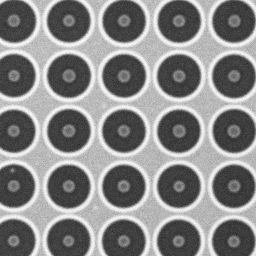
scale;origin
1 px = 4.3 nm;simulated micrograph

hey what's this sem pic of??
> an array of small figures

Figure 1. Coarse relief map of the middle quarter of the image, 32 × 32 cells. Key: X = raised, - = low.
-------XXX----------XXX---------
-------XX------------XX---------
XX-----XX-----XX-----XX-----XX--
XX-----XX-----XX-----XX-----XX--
-------XX------------XX---------
-------XXX----------XXX---------
------XXXX----------XXXX--------
-----XXXXXX--------XXXXXX-------
---XXXXXXXXXX----XXXXXXXXXX---XX
XXXXXXXXXXXXXXXXXXXXXXXXXXXXXXXX
XXXXXXXXXXXXXXXXXXXXXXXXXXXXXXXX
----XXXXXXXX------XXXXXXXX-----X
-----XXXXXX--------XXXXXX-------
------XXXX----------XXXX--------
-------XXX----------XXX---------
-X-----XX------------XX-----X---
XX-----XX-----XX-----XX-----XX--
XX-----XX-----XX-----XX-----XX--
-------XX------------XX---------
------XXXX----------XXXX--------
------XXXX----------XXXX--------
-----XXXXXXX------XXXXXXX-------
--XXXXXXXXXXXX--XXXXXXXXXXX---XX
XXXXXXXXXXXXXXXXXXXXXXXXXXXXXXXX
XXXXXXXXXXXXXXXXXXXXXXXXXXXXXXXX
----XXXXXXXX------XXXXXXXX------
-----XXXXXX--------XXXXXX-------
------XXXX----------XXXX--------
-------XXX----------XXX---------
-X-----XX-----X------XX---------
XX-----XX-----XX-----XX-----XX--
-X-----XX-----XX-----XX-----X---